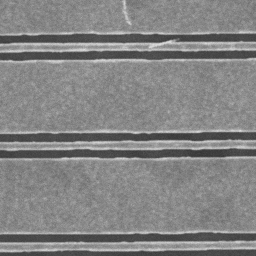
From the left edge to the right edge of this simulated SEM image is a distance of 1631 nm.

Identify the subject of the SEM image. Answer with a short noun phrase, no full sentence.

lines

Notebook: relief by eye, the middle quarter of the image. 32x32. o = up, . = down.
oooooooooooooooooooooooooooooooo
oooooooooooooooooooooooooooooooo
oooooooooooooooooooooooooooooooo
oooooooooooooooooooooooooooooooo
oooooooooooooooooooooooooooooooo
oooooooooooooooooooooooooooooooo
oooooooooooooooooooooooooooooooo
oooooooooooooooooooooooooooooooo
oooooooooooooooooooooooooooooooo
oooooooooooooooooooooooooooooooo
oooooooooooooooooooooooooooooooo
oooooooooooooooooooooooooooooooo
oooooooooooooooooooooooooooooooo
oooooooooooooooooooooooooooooooo
oooooooooooooooooooooooooooooooo
oooooooooooooooooooooooooooooooo
oooooooooooooooooooooooooooooooo
................................
................................
...o...ooooooooooooooooooooooooo
oooooooooooooooooooooooooooooooo
................................
................................
.............................ooo
oooooooooooooooooooooooooooooooo
oooooooooooooooooooooooooooooooo
oooooooooooooooooooooooooooooooo
oooooooooooooooooooooooooooooooo
oooooooooooooooooooooooooooooooo
oooooooooooooooooooooooooooooooo
oooooooooooooooooooooooooooooooo
oooooooooooooooooooooooooooooooo